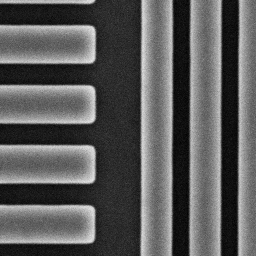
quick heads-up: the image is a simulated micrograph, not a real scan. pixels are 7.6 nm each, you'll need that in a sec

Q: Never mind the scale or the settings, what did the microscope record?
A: groups of lines, slits or small figures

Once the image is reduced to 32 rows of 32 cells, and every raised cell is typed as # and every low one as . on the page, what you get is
..................####..####..##
..................####..####..##
..................####..####..##
############......####..####..##
############......####..####..##
############......####..####..##
############......####..####..##
############......####..####..##
..................####..####..##
..................####..####..##
..................####..####..##
############......####..####..##
############......####..####..##
############......####..####..##
############......####..####..##
..................####..####..##
..................####..####..##
..................###...####..##
############......###...####..##
############......###...####..##
############......###...####..##
############......###...####..##
############......###...####..##
..................###...####..##
..................###...####..##
..................###...####..##
############......###...####..##
############......###...####..##
############......###...####..##
############......###...####..##
..................###...####..##
..................###...####..##